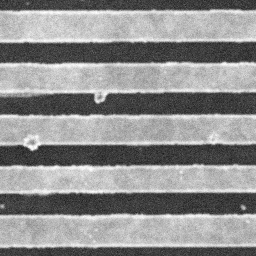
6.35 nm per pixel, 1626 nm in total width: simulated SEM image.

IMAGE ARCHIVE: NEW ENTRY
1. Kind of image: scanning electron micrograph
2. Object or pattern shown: lines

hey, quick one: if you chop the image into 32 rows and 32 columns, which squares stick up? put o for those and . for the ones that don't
................................
oo.oooo.o.o.ooo.oooooooooooooooo
oooooooooooooooooooooooooooooooo
oooooooooooooooooooooooooooooooo
oooooooooooooooooooooooooooooooo
................................
................................
................................
oooooooooooooooooooooooooooooooo
oooooooooooooooooooooooooooooooo
oooooooooooooooooooooooooooooooo
......oooo.ooo..................
............o...................
................................
...........oo.oo..ooo.o.ooooooo.
oooooooooooooooooooooooooooooooo
oooooooooooooooooooooooooooooooo
oooooooooooooooooooooooooooooooo
................................
................................
................................
oooooooooooooooooooooooooooooooo
oooooooooooooooooooooooooooooooo
oooooooooooooooooooooooooooooooo
................................
................................
................................
oooooooooooooooooooooooooooooooo
oooooooooooooooooooooooooooooooo
oooooooooooooooooooooooooooooooo
oooooooooooooooooooooooooooooooo
................................